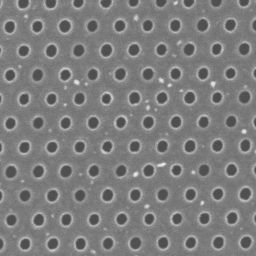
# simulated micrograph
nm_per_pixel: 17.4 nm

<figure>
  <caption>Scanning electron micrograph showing a regular array of holes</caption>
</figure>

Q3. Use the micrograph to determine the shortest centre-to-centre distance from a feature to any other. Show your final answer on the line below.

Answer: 477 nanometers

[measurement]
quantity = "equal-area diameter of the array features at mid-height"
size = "196 nm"